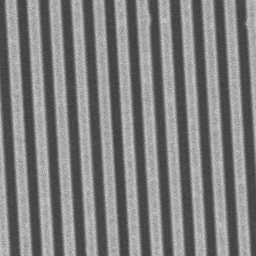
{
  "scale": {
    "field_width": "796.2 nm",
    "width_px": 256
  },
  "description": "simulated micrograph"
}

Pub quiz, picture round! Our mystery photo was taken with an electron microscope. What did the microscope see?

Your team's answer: parallel lines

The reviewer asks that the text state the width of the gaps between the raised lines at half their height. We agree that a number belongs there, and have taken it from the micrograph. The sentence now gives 30.7 nm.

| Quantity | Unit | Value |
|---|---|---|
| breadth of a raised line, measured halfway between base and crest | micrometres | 0.0365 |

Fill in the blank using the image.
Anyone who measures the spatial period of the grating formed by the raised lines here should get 0.0679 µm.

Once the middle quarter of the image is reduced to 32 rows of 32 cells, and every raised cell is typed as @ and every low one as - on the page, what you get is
---@@---@@@---@@---@@@--@@@---@@
---@@---@@@---@@---@@@---@@---@@
---@@@--@@@---@@@--@@@---@@---@@
---@@@--@@@---@@@--@@@---@@---@@
---@@@---@@---@@@--@@@---@@---@@
---@@@---@@---@@@--@@@---@@@--@@
---@@@---@@---@@@--@@@---@@@--@@
---@@@---@@---@@@---@@---@@@---@
---@@@---@@@--@@@---@@---@@@---@
@--@@@---@@@--@@@---@@---@@@---@
@---@@---@@@--@@@---@@---@@@---@
@---@@---@@@--@@@---@@---@@@---@
@---@@---@@@--@@@---@@@--@@@---@
@---@@---@@@--@@@---@@@--@@@---@
@---@@---@@@---@@---@@@--@@@---@
@---@@---@@@---@@---@@@--@@@---@
@---@@---@@@---@@---@@@--@@@---@
@---@@---@@@---@@---@@@---@@---@
@---@@---@@@---@@@--@@@---@@---@
@---@@@--@@@---@@@--@@@---@@---@
@---@@@---@@---@@@--@@@---@@---@
@---@@@---@@---@@@--@@@---@@---@
@---@@@---@@---@@@--@@@---@@@--@
@---@@@---@@---@@@--@@@---@@@---
@---@@@---@@---@@@---@@---@@@---
@@--@@@---@@@--@@@---@@---@@@---
@@--@@@---@@@--@@@---@@---@@@---
@@---@@---@@@--@@@---@@---@@@---
@@---@@---@@@--@@@---@@@--@@@---
@@---@@---@@@--@@@---@@@--@@@---
@@---@@---@@@---@@---@@@--@@@---
@@---@@---@@@---@@---@@@--@@@---